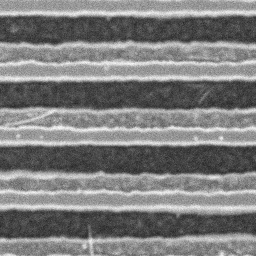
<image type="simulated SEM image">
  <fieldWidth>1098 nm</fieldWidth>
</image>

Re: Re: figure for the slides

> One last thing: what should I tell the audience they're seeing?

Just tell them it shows lines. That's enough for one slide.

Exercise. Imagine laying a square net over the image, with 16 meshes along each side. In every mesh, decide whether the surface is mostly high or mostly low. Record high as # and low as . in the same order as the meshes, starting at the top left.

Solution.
################
................
................
################
################
................
................
################
################
................
................
################
################
................
................
################